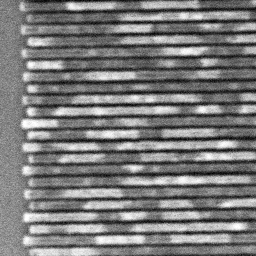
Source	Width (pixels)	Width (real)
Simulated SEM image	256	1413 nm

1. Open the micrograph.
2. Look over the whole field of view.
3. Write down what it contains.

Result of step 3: parallel lines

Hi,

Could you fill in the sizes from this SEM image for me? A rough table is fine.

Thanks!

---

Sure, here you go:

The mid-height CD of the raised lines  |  0.0387 um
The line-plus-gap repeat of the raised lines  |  11.7 pixels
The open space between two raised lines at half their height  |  0.029 microns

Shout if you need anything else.